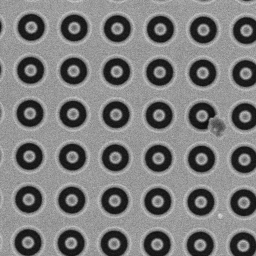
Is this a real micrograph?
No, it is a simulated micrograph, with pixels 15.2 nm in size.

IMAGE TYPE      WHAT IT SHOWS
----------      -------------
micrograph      an array of small figures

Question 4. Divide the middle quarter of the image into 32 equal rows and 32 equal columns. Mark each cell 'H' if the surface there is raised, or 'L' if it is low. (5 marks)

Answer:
LLHLLLHHHHLLLLLLLHHHHLLLLLLHHHHL
LHHHLLHHHLLLHHHLLHHHLLLHHLLLHHHL
LHHHLLHHHLLLHHLLLHHHLLLHHLLLHHHL
LLLLLLHHHHLLLLLLLHHHLLLLLLLHHHHL
LLLLLHHHHHLLLLLLHHHHHLLLLLLHHHHH
HHLHHHHHHHHHLLHHHHHHHHLLLHHHHHHH
HHHHHHHHHHHHHHHHHHHHHHHHHHHHHHHH
HHHHHHHHHHHHHHHHHHHHHHHHHHHHHHHH
HHHHHHHHHHHHHHHHHHHHHHHHHHHHHHHH
LLLLHHHHHHHLLLLHHHHHHHLLLLHHHHHH
LLLLLHHHHHLLLLLLHHHHHLLLLLLHHHHH
LHHLLLHHHLLLHHLLLHHHLLLHLLLHHHHL
LHHHLLHHHLLLHHLLLHHHLLLHHLLHHHHL
LHHLLLHHHLLLHHLLLHHHLLLHHLLHHHHL
LLLLLLHHHHLLLLLLHHHHLLLLLLLHHHHL
LLLLHHHHHHHLLLLHHHHHHLLLLLHHHHHH
HHHHHHHHHHHHHHHHHHHHHHHLLHHHHHHH
HHHHHHHHHHHHHHHHHHHHHHHHHHHHHHHH
HHHHHHHHHHHHHHHHHHHHHHHHHHHHHHHH
HHLHHHHHHHHHHHHHHHHHHHHHHHHHHHHH
LLLLLHHHHHHLLLLHHHHHHHLLLLHHHHHH
LLLLLHHHHHLLLLLLHHHHLLLLLLLHHHHL
LHHLLLHHHLLLHHLLHHHHLLLHLLLHHHHL
LHHLLLHHHLLHHHLLLHHHLLHHHLLHHHHL
LHHLLLHHHLLLHHLLHHHHLLLHHLLHHHHL
LLLLLHHHHHLLLLLLHHHHLLLLLLLHHHHL
LLLLHHHHHHHLLLLHHHHHHLLLLLHHHHHH
HHHHHHHHHHHHHHHHHHHHHHHLHHHHHHHH
HHHHHHHHHHHHHHHHHHHHHHHHHHHHHHHH
HHHHHHHHHHHHHHHHHHHHHHHHHHHHHHHH
HLLHHHHHHHHHLHHHHHHHHHHLHHHHHHHH
LLLLLHHHHHLLLLLHHHHHHLLLLLHHHHHH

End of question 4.